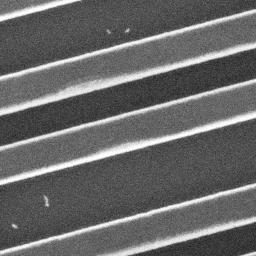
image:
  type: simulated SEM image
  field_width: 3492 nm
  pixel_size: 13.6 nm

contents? lines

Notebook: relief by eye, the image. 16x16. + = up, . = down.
+++.............
.............+++
.........+++++++
.....+++++++++..
.+++++++++......
++++++........++
++........++++++
......+++++++++.
...++++++++.....
+++++++.........
++++............
................
............++++
........++++++++
.....++++++++...
.+++++++++......